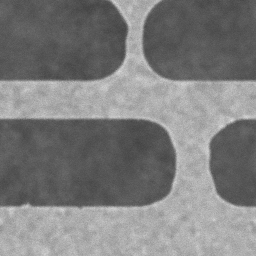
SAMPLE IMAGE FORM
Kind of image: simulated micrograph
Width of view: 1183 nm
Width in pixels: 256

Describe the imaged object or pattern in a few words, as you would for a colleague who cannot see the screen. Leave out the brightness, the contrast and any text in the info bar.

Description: one or a few lines or trenches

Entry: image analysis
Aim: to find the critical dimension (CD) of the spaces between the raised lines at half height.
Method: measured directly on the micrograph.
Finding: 415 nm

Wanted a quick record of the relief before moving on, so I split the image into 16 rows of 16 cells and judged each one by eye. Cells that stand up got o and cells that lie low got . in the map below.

.......oo.......
........o.......
........o.......
........o.......
.......ooo......
oooooooooooooooo
oooooooooooooooo
.........oooooo.
...........oo...
...........oo...
...........oo...
...........oo...
..........oooo..
oooooooooooooooo
oooooooooooooooo
oooooooooooooooo